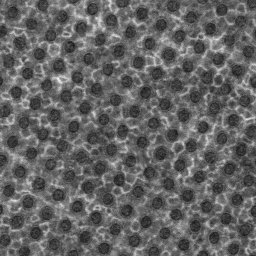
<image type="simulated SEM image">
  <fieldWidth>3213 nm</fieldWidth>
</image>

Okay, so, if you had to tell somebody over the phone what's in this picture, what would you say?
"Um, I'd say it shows a regular array of raised bodies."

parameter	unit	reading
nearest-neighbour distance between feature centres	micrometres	0.275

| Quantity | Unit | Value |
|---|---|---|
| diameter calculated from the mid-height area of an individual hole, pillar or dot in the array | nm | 158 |